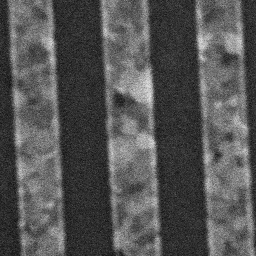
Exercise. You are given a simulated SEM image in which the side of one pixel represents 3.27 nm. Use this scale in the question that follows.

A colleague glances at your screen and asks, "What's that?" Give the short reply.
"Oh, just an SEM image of one or a few lines or trenches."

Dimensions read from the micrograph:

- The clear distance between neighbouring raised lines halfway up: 177 nm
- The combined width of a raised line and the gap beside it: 307 nanometers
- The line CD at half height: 128 nm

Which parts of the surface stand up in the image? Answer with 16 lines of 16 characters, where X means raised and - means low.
-XX---XXX---XXX-
-XX----XX---XXX-
-XX----XX----XX-
-XX----XX----XX-
-XX----XX----XX-
-XX----XX----XX-
-XX----XX----XX-
-XX----XX----XX-
-XXX---XX----XX-
-XXX---XXX---XX-
-XXX---XXX---XX-
-XXX---XXX---XX-
-XXX---XXX---XXX
-XXX---XXX---XXX
-XXX---XXX---XXX
-XXX---XXX---XXX